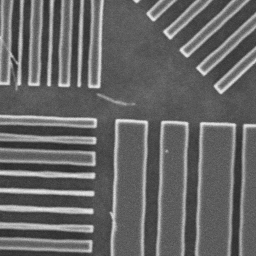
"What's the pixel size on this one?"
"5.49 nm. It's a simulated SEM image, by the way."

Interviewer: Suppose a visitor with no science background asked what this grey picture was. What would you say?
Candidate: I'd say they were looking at groups of lines, slits or small figures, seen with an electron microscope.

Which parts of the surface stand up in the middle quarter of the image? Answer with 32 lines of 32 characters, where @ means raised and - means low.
@-----@@@-----------------------
@-----@@@-----------------------
@-----@@@-----------------------
@-----@@@-----------------------
@-----@@@-----------------------
------@@@-----------------------
--------------------------------
--------------------------------
--------------------------------
--------------------------------
--------------------------------
--------------------------------
--------------------------------
--------------------------------
@@@@@@@@-----@@@@@@@------------
--@@@@@@-----@@@@@@@@----@@@@@@-
-------------@@@@@@@@---@@@@@@@-
-------------@@@@@@@@---@@@@@@@-
@@@@@@@------@@@@@@@@---@@@@@@@-
@@@@@@@@-----@@@@@@@----@@@@@@@-
-------------@@@@@@@@---@@@@@@@-
-------------@@@@@@@@---@@@@@@--
@@@@@@@------@@@@@@@@---@@@@@@--
@@@@@@@------@@@@@@@----@@@@@@--
@@@@@@@@-----@@@@@@@----@@@@@@--
-------------@@@@@@@----@@@@@@--
-------------@@@@@@@----@@@@@@--
@--@@@-------@@@@@@@----@@@@@@--
-------------@@@@@@@----@@@@@@--
-------------@@@@@@@----@@@@@@--
-------------@@@@@@@----@@@@@@--
-------------@@@@@@@----@@@@@@--